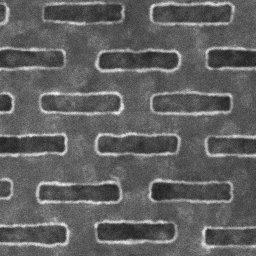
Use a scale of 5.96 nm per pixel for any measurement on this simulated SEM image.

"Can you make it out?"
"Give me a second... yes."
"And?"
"a regular array of holes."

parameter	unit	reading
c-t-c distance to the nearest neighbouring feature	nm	402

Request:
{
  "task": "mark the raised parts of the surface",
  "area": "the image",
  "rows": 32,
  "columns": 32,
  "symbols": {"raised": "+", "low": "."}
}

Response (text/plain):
+++++++++++....+++++++++++++++++
.++++..........++++..........+++
.++++++........++++..........+++
++++++++++++++++++++++++++++++++
++++++++++++++++++++++++++++++++
++++++++++++++++++++++++++++++++
........++++++..++....++++......
........++++..........++++......
..+++++++++++......+..++++++++++
++++++++++++++++++++++++++++++++
++++++++++++++++++++++++++++++++
++++++++++++++++++++++++++++++++
.++++..........++++..........+++
.++++..........++++..........+++
++++++++++++++++++++++++++++++++
++++++++++++++++++++++++++++++++
++++++++++++++++++++++++++++++++
........++++..........++++......
........++++..........++++......
++++++++++++++++++++++++++++++++
++++++++++++++++++++++++++++++++
++++++++++++++++++++++++++++++++
.+++++++++++++++++++++++++++++++
.++++..........++++..........+++
.++++..........++++..........+++
++++++++++++++++++++++++++++++++
++++++++++++++++++++++++++++++++
++++++++++++++++++++++++++++++++
........++++..........+++++++++.
........++++..........++++......
+++++..+++++++++++++++++++......
++++++++++++++++++++++++++++++++